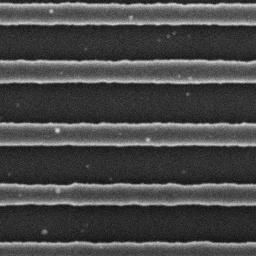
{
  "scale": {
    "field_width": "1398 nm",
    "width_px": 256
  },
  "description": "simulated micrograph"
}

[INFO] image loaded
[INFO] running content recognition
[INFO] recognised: lines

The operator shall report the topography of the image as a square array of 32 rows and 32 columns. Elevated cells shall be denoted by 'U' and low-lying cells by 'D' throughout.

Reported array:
UUDDDUUUUUUDDUDDDDDUDUDDDDDUDUDD
UUUUUUUUUUUUUUUUUUUUUUUUUUUUUUUU
UUUUUUUUUUUUUUUUUUUUUUUUUUUUUUUU
DDDDDDDDDDDDDDDDDDDDDDDDDDDDDDDD
DDDDDDDDDDDDDDDDDDDDDDDDDDDDDDDD
DDDDDDDDDDDDDDDDDDDDDDDDDDDDDDDD
DDDDDDDDDDDDDDDDDDDDDDDDDDDDDDDD
DDDDDDDDDDDDDDDDDDDDDDDDDDDDDDDD
UUUUUUUUUUUUUUUUUUUUUUUUUUUUUUUU
UUUUUUUUUUUUUUUUUUUUUUUUUUUUUUUU
DDDDDDDDDDDDDDDDDDDDDDDDDDDDDDDD
DDDDDDDDDDDDDDDDDDDDDDDDDDDDDDDD
DDDDDDDDDDDDDDDDDDDDDDDDDDDDDDDD
DDDDDDDDDDDDDDDDDDDDDDDDDDDDDDDD
DDDDDDDDDDDDDDDDDDDDDDDDDDDDDDDD
UUUUUUUUUUUUUUUUDUUUUUUUUUUUUUUU
UUUUUUUUUUUUUUUUUUUUUUUUUUUUUUUU
UUUUUUUUUUUUUUUUUUUUUUUUUUUUUUUU
DDDDDDDDDDDDDDDDDDDDDDDDDDDDDDDD
DDDDDDDDDDDDDDDDDDDDDDDDDDDDDDDD
DDDDDDDDDDDDDDDDDDDDDDDDDDDDDDDD
DDDDDDDDDDDDDDDDDDDDDDDDDDDDDDDD
DDDDDDDDDDDDDDDDDDDDDDDDDDDDDDDD
UUUUUUUUUUUUUUUUUUUUUUUUUUUUUUUU
UUUUUUUUUUUUUUUUUUUUUUUUUUUUUUUU
UUUDDUUDDUUUUUUUUUUUUUUDDUUUUUUU
DDDDDDDDDDDDDDDDDDDDDDDDDDDDDDDD
DDDDDDDDDDDDDDDDDDDDDDDDDDDDDDDD
DDDDDDDDDDDDDDDDDDDDDDDDDDDDDDDD
DDDDDDDDDDDDDDDDDDDDDDDDDDDDDDDD
UUUUUUUUUUUUUUUUUUUUUUUUUUUUUUUU
UUUUUUUUUUUUUUUUUUUUUUUUUUUUUUUU